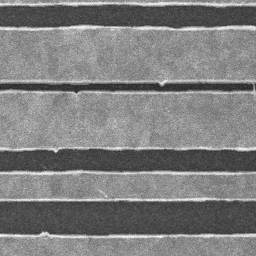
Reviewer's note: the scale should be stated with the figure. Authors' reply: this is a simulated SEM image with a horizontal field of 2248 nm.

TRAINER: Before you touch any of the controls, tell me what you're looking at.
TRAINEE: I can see one or a few lines or trenches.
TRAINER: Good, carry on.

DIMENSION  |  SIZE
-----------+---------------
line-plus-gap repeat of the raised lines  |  0.578 µm